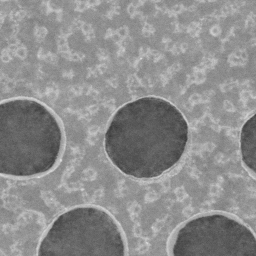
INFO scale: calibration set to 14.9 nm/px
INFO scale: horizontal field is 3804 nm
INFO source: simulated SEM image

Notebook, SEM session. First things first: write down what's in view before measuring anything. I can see holes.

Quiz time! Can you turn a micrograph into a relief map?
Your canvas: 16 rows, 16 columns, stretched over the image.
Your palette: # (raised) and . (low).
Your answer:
################
################
################
################
################
################
..######...#####
...####.....####
....###.....###.
....###....####.
...####....####.
################
################
####...#####..##
###.....###.....
##......###.....